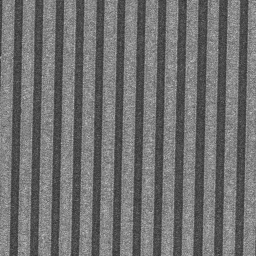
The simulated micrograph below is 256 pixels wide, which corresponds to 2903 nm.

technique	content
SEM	parallel lines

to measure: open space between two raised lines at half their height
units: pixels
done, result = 8.62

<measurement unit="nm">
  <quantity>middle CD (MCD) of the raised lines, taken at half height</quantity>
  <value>136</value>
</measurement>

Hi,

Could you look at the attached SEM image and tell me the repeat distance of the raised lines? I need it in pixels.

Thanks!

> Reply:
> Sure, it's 20.5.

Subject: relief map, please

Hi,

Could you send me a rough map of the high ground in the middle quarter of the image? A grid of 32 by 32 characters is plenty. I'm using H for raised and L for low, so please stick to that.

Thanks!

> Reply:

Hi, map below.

HHLLLHHHLLHHHLLHHHLLHHHLLHHHLLLH
HHLLLHHHLLHHHLLHHHLLHHHLLHHHLLLH
HHLLLHHHLLHHHLLHHHLLHHHLLHHHLLLH
HHLLLHHHLLHHHLLHHHLLHHHLLHHHLLLH
HHLLLHHHLLHHHLLHHHLLHHHLLHHHLLLH
HHLLLHHLLLHHHLLHHHLLHHHLLHHHLLHH
HHLLLHHLLLHHHLLHHHLLHHHLLHHHLLHH
HHLLLHHLLLHHHLLHHHLLHHHLLHHHLLHH
HHLLLHHLLLHHHLLHHHLLHHHLLHHHLLHH
HHLLLHHLLLHHHLLHHHLLHHHLLHHHLLHH
HHLLLHHLLLHHHLLHHHLLHHHLLHHHLLHH
HHLLLHHLLLHHHLLHHHLLHHHLLHHHLLHH
HHLLLHHLLLHHHLLHHHLLHHHLLHHHLLHH
HHLLLHHLLLHHHLLHHHLLHHHLLHHHLLHH
HHLLLHHLLLHHHLLHHHLLHHHLLHHHLLHH
HHLLLHHLLLHHHLLHHHLLHHHLLHHHLLHH
HHLLLHHLLLHHHLLHHHLLHHHLLHHHLLHH
HHLLLHHLLLHHHLLHHHLLHHHLLHHHLLHH
HHLLLHHLLLHHHLLHHHLLHHHLLHHHLLHH
HHLLLHHLLLHHHLLHHHLLHHHLLHHHLLHH
HHLLLHHLLLHHHLLHHLLLHHHLLHHHLLHH
HHLLLHHLLLHHLLLHHLLLHHHLLHHHLLHH
HHLLLHHLLLHHLLLHHLLLHHHLLHHHLLHH
HHLLLHHLLHHHLLLHHLLLHHHLLHHHLLHH
HHLLLHHLLHHHLLLHHLLLHHHLLHHLLLHH
HHLLLHHLLHHHLLLHHLLLHHHLLHHLLLHH
HHLLHHHLLHHHLLLHHLLLHHHLLHHLLLHH
HHLLHHHLLHHHLLLHHLLLHHLLLHHLLLHH
HHLLHHHLLHHHLLLHHLLLHHLLLHHLLLHH
HHLLHHHLLHHHLLLHHLLLHHLLLHHLLLHH
HHLLHHHLLHHHLLHHHLLLHHLLLHHLLLHH
HHLLHHHLLHHHLLHHHLLLHHLLLHHLLLHH